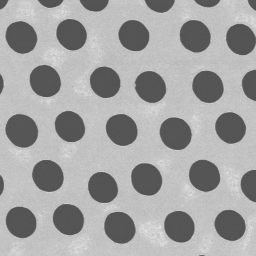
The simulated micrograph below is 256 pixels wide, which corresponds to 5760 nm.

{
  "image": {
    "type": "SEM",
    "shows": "a regular array of holes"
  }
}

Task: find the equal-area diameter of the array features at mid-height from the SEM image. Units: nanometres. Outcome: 707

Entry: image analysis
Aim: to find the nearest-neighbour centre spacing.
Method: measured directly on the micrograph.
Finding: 1090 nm